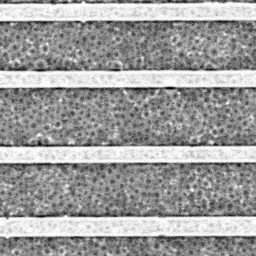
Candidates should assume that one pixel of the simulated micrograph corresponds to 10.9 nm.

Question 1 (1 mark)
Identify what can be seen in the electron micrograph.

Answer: one or a few lines or trenches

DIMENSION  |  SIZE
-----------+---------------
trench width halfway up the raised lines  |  56.5 px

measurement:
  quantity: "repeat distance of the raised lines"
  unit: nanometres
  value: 780